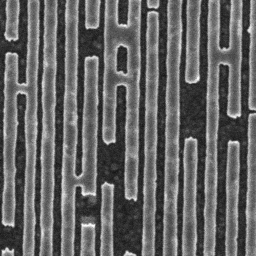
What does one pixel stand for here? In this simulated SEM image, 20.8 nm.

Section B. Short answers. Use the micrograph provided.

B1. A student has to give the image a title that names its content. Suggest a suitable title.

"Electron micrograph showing parallel lines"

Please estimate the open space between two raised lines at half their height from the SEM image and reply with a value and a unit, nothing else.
174 nm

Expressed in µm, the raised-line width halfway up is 0.245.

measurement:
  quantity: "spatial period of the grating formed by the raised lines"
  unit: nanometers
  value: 423